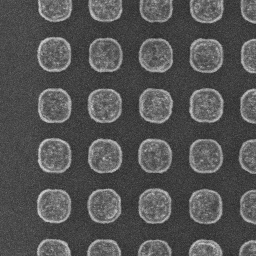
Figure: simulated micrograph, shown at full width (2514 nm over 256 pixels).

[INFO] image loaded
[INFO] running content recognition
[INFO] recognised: a regular array of raised bodies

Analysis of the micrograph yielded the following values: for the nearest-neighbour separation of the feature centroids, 492 nm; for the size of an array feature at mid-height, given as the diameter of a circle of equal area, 33.7 pixels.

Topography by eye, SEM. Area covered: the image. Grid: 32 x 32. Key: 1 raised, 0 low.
00000111100111100011100011110011
00000111100111100011100011110011
00000011000001000011100001100001
00000000000000000000000000000000
00000000000000000000000000000000
00000111000011100011100011100001
00000111100111100111100011110011
00000111100111100011100011110011
00000011000011100011100011100001
00000000000000000000000000000000
00000000000000000000000000000000
00000011000011000011100001100001
00000111100111100011100011110011
00000111100111100011100011110011
00000111100111100011100011100011
00000000000000000000000000000000
00000000000000000000000000000000
00000011000000000000000000000000
00000111100111100011100011110011
00000111100111100011100011110011
00000111100111100011100011110011
00000011000010000000000001100001
00000000000000000000000000000000
00000000000000000000000000000000
00000111000111100011100011100001
00000111100111100111100011110011
00000111100111100111100011110011
00000011000011000011100011100001
00000000000000000000000000000000
00000000000000000000000000000000
00000111000011000011100011100001
00000111100111100111100011110011